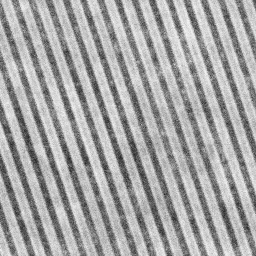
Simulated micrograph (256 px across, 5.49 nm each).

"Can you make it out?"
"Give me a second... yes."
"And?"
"parallel lines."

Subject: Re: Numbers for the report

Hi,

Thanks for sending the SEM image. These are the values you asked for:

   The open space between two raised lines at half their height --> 47.5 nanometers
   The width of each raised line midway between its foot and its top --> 7.81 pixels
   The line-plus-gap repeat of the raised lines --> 89.5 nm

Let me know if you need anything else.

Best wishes